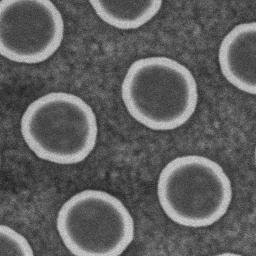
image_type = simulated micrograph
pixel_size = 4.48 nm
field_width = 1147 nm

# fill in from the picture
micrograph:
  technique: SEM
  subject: raised bodies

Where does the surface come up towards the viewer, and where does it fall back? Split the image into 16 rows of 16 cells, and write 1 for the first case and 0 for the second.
1110001111000000
1111000100000000
1111000000000011
0110000000000011
0000000011110011
0000000011110001
0011100011110000
0011110001100000
0011110000000000
0001100000000000
0000000000011000
0000000000111100
0000011000111100
0000111100011100
1000111100000000
1100011100000000